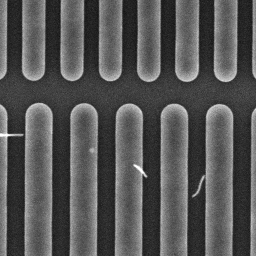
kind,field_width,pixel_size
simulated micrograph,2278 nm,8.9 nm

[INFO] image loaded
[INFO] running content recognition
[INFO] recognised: groups of lines, slits or small figures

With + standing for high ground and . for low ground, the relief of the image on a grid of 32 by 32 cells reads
+..+++..++..+++..+++..+++..+++..
+..+++..++..+++..+++..+++..+++..
+..+++..++..+++..+++..+++..+++..
+..+++..++..+++..+++..+++..+++..
+..+++..++..+++..+++..+++..+++..
+..+++..++..+++..+++..+++..+++..
+..+++..++..+++..+++..+++..+++..
+..+++..++..+++..+++..+++..+++..
+..+++..++..+++..+++..+++..+++..
...++...++...++..+++..+++..++...
................................
................................
................................
....++...+++...++....++...+++...
+..++++..+++...+++..+++...+++...
+..++++..+++...+++..+++...+++...
+..++++..+++...+++..+++...+++...
+..++++..+++...+++..+++...+++...
+..+++...+++...+++..+++...+++...
+..+++...+++...+++..+++...+++...
+..+++...+++...+++..+++...+++..+
+..+++...+++...+++..+++...+++..+
+..+++...+++...+++..+++...+++..+
+..+++...+++...+++..+++...+++..+
+..+++...+++...+++..+++...+++..+
+..+++...+++...+++..+++...+++..+
+..+++...+++...+++..+++...+++..+
+..+++...+++...+++..+++...+++..+
+..+++...+++...+++..+++...+++..+
+..+++...+++..++++..+++...+++..+
+..+++...+++..++++..+++...+++..+
+..+++...+++..++++..+++...+++..+